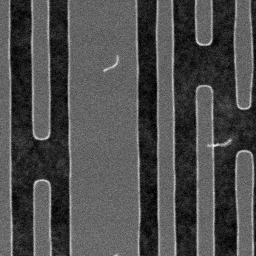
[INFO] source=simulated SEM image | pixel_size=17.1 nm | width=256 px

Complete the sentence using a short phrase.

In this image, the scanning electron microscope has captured groups of lines, slits or small figures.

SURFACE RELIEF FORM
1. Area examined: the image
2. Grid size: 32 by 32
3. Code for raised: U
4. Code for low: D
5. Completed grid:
UDDDUUDDDUUUUUUUUDDDUDDDDUUDDDUD
UDDDUUDDDUUUUUUUUDDDUDDDDUUDDDUD
UDDDUUDDDUUUUUUUUDDDUUDDDUUDDUUD
UDDDUUDDDUUUUUUUUDDDUUDDDUUDDUUD
UDDDUUDDDUUUUUUUUDDDUUDDDUUDDUUU
UDDDUUDDDUUUUUUUUDDDUUDDDUDDDUUU
UDDDUUDDDUUUUUUUUDDDUUDDDDDDDUUU
UDDDUUDDDUUUUUUUUDDDUUDDDDDDDUUU
UDDDUUDDDUUUUUUUUDDDUUDDDDDDDUUU
UDDDUUDDDUUUUUUUUDDDUUDDDDDDDDUU
UDDDUUDDDUUUUUUUUDDDUUDDDDDDDDUD
UDDDUUDDDUUUUUUUUDDDUUDDDUUDDDUD
UDDDUUDDDUUUUUUUUDDDUUDDDUUDDDUD
UDDDUUDDDUUUUUUUUDDDUUDDDUUDDDUD
UDDDUUDDDUUUUUUUUDDDUUDDDUUDDDDD
UDDDUUDDDUUUUUUUUDDDUUDDDUUDDDDD
UDDDUUDDDUUUUUUUUDDDUUDDDUUDDDDD
UDDDDDDDDUUUUUUUUDDDUUDDDUUDDDDD
UDDDDDDDDUUUUUUUUDDDUUDDDUUDDDDD
UDDDDDDDDUUUUUUUUDDDUUDDDUUDDDUU
UDDDDDDDDUUUUUUUUDDDUUDDDUUDDDUU
UDDDDDDDDUUUUUUUUDDDUUDDDUUDDDUU
UDDDDDDDDUUUUUUUUDDDUUDDDUUDDDUU
UDDDUUDDDUUUUUUUUDDDUUDDDUUDDDUU
UDDDUUDDDUUUUUUUUDDDUUDDDUUDDDUU
UDDDUUDDDUUUUUUUUDDDUUDDDUUDDDUU
UDDDUUDDDUUUUUUUUDDDUUDDDUUDDDUU
UDDDUUDDDUUUUUUUUDDDUUDDDUUDDDUU
UDDDUUDDDUUUUUUUUDDDUUDDDUUDDDUU
UDDDUUDDDUUUUUUUUDDDUUDDDUUDDDUU
UDDDUUDDDUUUUUUUUDDDUUDDDUUDDDUU
UDDDUUDDDUUUUUUUUDDDUUDDDUUDDDUU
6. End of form